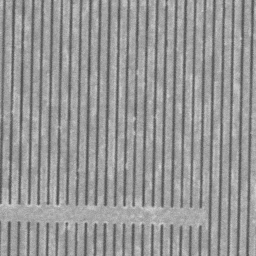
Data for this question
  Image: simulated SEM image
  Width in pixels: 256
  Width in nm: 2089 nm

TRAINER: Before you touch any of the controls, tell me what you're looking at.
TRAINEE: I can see parallel lines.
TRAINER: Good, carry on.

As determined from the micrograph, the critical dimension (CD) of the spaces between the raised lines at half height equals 22.4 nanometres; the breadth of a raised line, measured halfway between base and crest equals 52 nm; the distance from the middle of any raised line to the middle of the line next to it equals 77.9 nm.